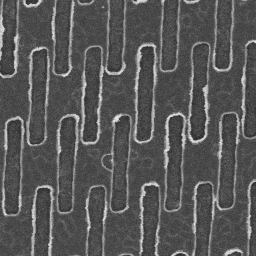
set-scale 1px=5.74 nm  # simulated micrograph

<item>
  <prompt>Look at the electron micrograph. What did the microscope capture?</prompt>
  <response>a regular array of holes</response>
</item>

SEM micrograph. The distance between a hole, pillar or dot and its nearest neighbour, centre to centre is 53.6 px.